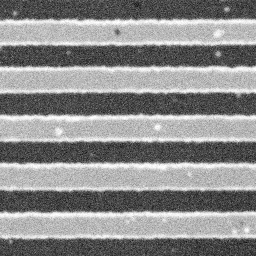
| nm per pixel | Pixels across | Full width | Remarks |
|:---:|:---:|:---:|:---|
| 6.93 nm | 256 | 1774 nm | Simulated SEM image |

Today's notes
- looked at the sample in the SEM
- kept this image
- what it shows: lines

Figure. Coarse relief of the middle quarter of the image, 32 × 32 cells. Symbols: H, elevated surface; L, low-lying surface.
LLLLLLLLLLLLLLLLLLLLLLLLLLLLLLLL
HHHHHHHHHHHHHHHHHHHHHHHHHHHHHHHH
HHHHHHHHHHHHHHHHHHHHHHHHHHHHHHHH
HHHHHHHHHHHHHHHHHHHHHHHHHHHHHHHH
HHHHHHHHHHHHHHHHHHHHHHHHHHHHHHHH
HHHHHHHHHHHHHHHHHHHHHHHHHHHHHHHH
HHHHHHHHHHHHHHHHHHHHHHHHHHHHHHHH
LLLLLLLLLLLLLLLLLLLLLLLLLLLLLLLL
LLLLLLLLLLLLLLLLLLLLLLLLLLLLLLLL
LLLLLLLLLLLLLLLLLLLLLLLLLLLLLLLL
LLLLLLLLLLLLLLLLLLLLLLLLLLLLLLLL
LLLLLLLLLLLLLLLLLLLLLLLLLLLLLLLL
LLLLLLLLLLLLLLLLLLLLLLLLLLLLLLLL
HHHHHHHHHHHHHHHHHHHHHHHHHHHHHHHH
HHHHHHHHHHHHHHHHHHHHHHHHHHHHHHHH
HHHHHHHHHHHHHHHHHHHHHHHHHHHHHHHH
HHHHHHHHHHHHHHHHHHHHHHHHHHHHHHHH
HHHHHHHHHHHHHHHHHHHHHHHHHHHHHHHH
HHHHHHHHHHHHHHHHHHHHHHHHHHHHHHHH
LLLLLLLLLLLLLLLLLLLLLLLLLLLLLLLL
LLLLLLLLLLLLLLLLLLLLLLLLLLLLLLLL
LLLLLLLLLLLLLLLLLLLLLLLLLLLLLLLL
LLLLLLLLLLLLLLLLLLLLLLLLLLLLLLLL
LLLLLLLLLLLLLLLLLLLLLLLLLLLLLLLL
LLLLLLLLLLLLLLLLLLLLLLLLLLLLLLLL
HHHHHHHHHHHHHHHHHHHHHHHHHHHHHHHH
HHHHHHHHHHHHHHHHHHHHHHHHHHHHHHHH
HHHHHHHHHHHHHHHHHHHHHHHHHHHHHHHH
HHHHHHHHHHHHHHHHHHHHHHHHHHHHHHHH
HHHHHHHHHHHHHHHHHHHHHHHHHHHHHHHH
HHHHHHHHHHHHHHHHHHHHHHHHHHHHHHHH
HHLLLLLHHHLLLLLLLLHHLLLLHLLLLLHL